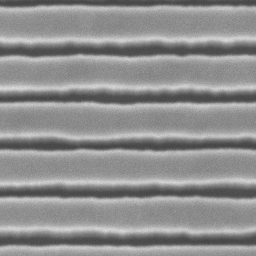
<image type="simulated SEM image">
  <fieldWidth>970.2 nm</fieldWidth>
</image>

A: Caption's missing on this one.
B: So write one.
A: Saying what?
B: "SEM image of lines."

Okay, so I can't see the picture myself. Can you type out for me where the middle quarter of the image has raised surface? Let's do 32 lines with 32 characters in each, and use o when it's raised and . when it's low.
oooooooooooooooooooooooooooooooo
oooooooooooooooooooooooooooooooo
oooooooooooooooooooooooooooooooo
oooooooooooooooooooooooooooooooo
oooooooooooooooooooooooooooooooo
oooooooooooooooooooooooooooooooo
oo.ooooo...ooooooooooooooooooo..
................................
................................
................................
oooooooooooooooooooooooooooooooo
oooooooooooooooooooooooooooooooo
oooooooooooooooooooooooooooooooo
oooooooooooooooooooooooooooooooo
oooooooooooooooooooooooooooooooo
oooooooooooooooooooooooooooooooo
oooooooooooooooooooooooooooooooo
oooooooooooooooooooooooooooooooo
oooooooooooooooooooooooooooooooo
...oo...........................
................................
...o............................
oooooooooooooooooooooooooooooooo
oooooooooooooooooooooooooooooooo
oooooooooooooooooooooooooooooooo
oooooooooooooooooooooooooooooooo
oooooooooooooooooooooooooooooooo
oooooooooooooooooooooooooooooooo
oooooooooooooooooooooooooooooooo
oooooooooooooooooooooooooooooooo
ooooooooooooooooooooo..ooooooooo
................................